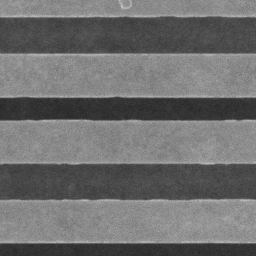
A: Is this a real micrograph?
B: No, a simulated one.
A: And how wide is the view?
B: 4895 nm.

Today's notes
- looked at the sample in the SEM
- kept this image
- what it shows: lines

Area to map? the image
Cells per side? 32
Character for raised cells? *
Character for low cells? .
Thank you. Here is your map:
********************************
********************************
................................
................................
................................
................................
................................
********************************
********************************
********************************
********************************
********************************
................................
................................
................................
********************************
********************************
********************************
********************************
********************************
................................
................................
................................
................................
................................
********************************
********************************
********************************
********************************
********************************
................................
................................